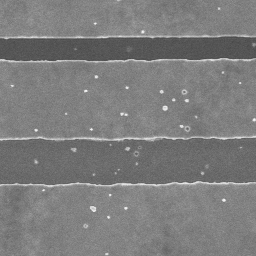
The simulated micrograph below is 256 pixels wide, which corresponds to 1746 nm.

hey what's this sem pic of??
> lines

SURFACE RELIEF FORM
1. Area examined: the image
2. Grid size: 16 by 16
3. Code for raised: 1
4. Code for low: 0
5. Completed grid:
1111111111111111
1111111111111111
0000000000000000
0000000000000000
1111111111111111
1111111111111111
1111111111111111
1111111111111111
1111111111111111
0000000000000000
0000000000000000
1100110110111111
1111111111111111
1111111111111111
1111111111111111
1111111111111111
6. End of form